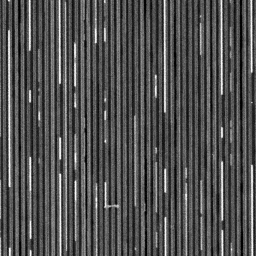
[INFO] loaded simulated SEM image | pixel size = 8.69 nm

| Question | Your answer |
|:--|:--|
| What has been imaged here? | parallel lines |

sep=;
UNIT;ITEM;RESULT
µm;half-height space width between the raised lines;0.0304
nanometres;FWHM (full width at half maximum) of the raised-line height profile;22.8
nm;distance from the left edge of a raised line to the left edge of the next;52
